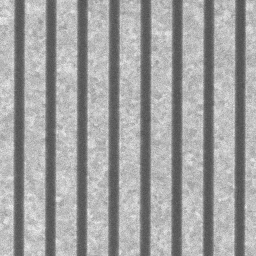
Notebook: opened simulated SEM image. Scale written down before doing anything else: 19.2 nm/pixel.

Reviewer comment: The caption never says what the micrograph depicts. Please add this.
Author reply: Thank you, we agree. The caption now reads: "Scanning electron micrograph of parallel lines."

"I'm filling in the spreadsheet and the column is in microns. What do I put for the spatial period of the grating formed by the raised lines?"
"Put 0.605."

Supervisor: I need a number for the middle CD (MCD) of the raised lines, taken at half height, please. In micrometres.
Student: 0.424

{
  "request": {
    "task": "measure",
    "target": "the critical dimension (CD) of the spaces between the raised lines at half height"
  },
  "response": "185 nm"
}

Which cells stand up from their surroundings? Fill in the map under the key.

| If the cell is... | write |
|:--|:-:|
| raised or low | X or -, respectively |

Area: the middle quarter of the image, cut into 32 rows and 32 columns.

XXX---XXXXX---XXXXX---XXXXX---XX
XXX---XXXXX---XXXXX---XXXXX---XX
XXX---XXXXX---XXXXX---XXXXX---XX
XXX---XXXXX---XXXXX---XXXXX---XX
XXX---XXXXX---XXXXX---XXXXX---XX
XXX---XXXXX---XXXXX---XXXXX---XX
XXX---XXXXX---XXXXX---XXXXX---XX
XXX---XXXXX---XXXXX---XXXXX---XX
XXX---XXXXX---XXXXX---XXXXX---XX
XXX---XXXXX---XXXXX---XXXXX--XXX
XXX---XXXXX---XXXXX---XXXXX--XXX
XXX---XXXXX---XXXXX---XXXXX--XXX
XXX---XXXXX---XXXXX---XXXXX--XXX
XXX---XXXXX---XXXXX---XXXXX--XXX
XXX---XXXXX---XXXXX---XXXXX--XXX
XXX---XXXXX---XXXXX---XXXXX--XXX
XXX---XXXXX---XXXXX---XXXXX--XXX
XXX---XXXXX---XXXXX---XXXXX--XXX
XXX---XXXXX---XXXXX---XXXXX--XXX
XXX---XXXXX---XXXXX---XXXXX--XXX
XXX---XXXXX---XXXXX---XXXXX--XXX
XXX---XXXXX---XXXXX---XXXXX--XXX
XXX---XXXXX---XXXXX---XXXXX--XXX
XXX---XXXXX---XXXXX---XXXXX--XXX
XXX---XXXXX---XXXXX---XXXXX--XXX
XXX---XXXXX---XXXXX---XXXXX--XXX
XXX---XXXXX---XXXXX---XXXXX--XXX
XXX---XXXXX---XXXXX---XXXXX--XXX
XXX---XXXXX---XXXXX---XXXXX--XXX
XXX---XXXXX---XXXXX---XXXXX--XXX
XXX---XXXXX---XXXXX---XXXXX--XXX
XXX---XXXXX---XXXXX---XXXXX--XXX